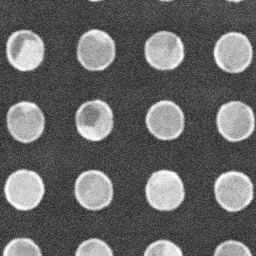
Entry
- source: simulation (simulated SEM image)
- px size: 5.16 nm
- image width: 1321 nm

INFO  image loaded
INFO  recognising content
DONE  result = a regular array of raised bodies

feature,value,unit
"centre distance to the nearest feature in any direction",353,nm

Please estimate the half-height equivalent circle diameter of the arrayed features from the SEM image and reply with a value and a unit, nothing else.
193 nanometers